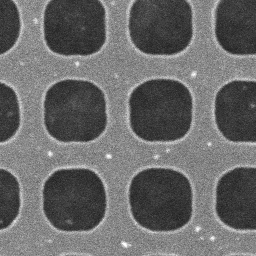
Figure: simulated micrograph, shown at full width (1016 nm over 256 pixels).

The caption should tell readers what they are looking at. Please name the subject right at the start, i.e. holes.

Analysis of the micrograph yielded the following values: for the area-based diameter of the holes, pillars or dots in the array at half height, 0.263 micrometres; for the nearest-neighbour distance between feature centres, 343 nanometers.